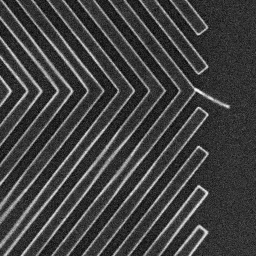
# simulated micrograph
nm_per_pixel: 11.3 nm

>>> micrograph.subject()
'groups of lines, slits or small figures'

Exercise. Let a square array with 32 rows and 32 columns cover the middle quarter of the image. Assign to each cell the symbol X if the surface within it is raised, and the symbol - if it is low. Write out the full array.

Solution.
-XXXX----XXXX---XXXXX---XXXX----
--XXXX----XXXX---XXXX----XXXX---
---XXXX---XXXX----XXXX----XXXX--
----XXX----XXXX----XXXX----XXXX-
----XXXX----XXXX----XXXX---XXXX-
X----XXXX----XXXX---XXXX----XXXX
XX----XXXX---XXXXX---XXXX----XXX
XX---XXXXX---XXXX----XXXX---XXXX
X----XXXX---XXXX----XXXX----XXXX
----XXXX----XXXX---XXXX----XXXX-
---XXXX----XXXX---XXXX----XXXX--
--XXXX----XXXX----XXXX---XXXX---
-XXXXX---XXXX----XXXX---XXXXX---
-XXXX---XXXX----XXXX----XXXX---X
XXXX----XXXX---XXXX----XXXX----X
XXX----XXXX---XXXXX---XXXX----XX
XX----XXXX----XXXX---XXXX----XXX
XX---XXXX----XXXX----XXXX---XXXX
X----XXX----XXXX----XXXX---XXXX-
----XXXX----XXX----XXXX----XXXX-
---XXXX----XXX----XXXX----XXXX--
--XXXX----XXXX----XXXX---XXXX---
--XXX-----XXX----XXXX---XXXX----
-XXX-----XXX----XXXX----XXXX---X
XXXX----XXX-----XXX----XXXX----X
XXX----XXX-----XXX----XXXX----XX
XX----XXXX----XXX----XXXX----XXX
X----XXXX----XXX-----XXX----XXXX
X----XXX----XXXX----XXXX---XXXX-
----XXX-----XXX----XXXX----XXXX-
---XXXX----XXX----XXXX----XXXX--
--XXXX----XXXX----XXX----XXXX---